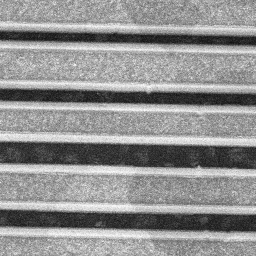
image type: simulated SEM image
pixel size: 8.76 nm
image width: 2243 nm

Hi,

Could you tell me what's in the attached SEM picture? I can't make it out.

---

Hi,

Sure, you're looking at one or a few lines or trenches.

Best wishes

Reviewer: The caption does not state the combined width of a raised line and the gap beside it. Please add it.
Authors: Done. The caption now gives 0.535 micrometres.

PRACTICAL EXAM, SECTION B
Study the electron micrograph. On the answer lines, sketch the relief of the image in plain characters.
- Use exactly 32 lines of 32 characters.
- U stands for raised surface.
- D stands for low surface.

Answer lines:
UUUUUUUUUUUUUUUUUUUUUUUUUUUUUUUU
UUUUUUUUUUUUUUUUUUUUUUUUUUUUUUUU
UUUUUUUUUUUUUUUUUUUUUUUUUUUUUUUU
DDDDDDDDDDUUUUUUUUUUUUUUUUUUUUUU
DDDDDDDDDDDDDDDDDDDDDDDDDDDDDDDD
DDDDDDDDDDDDDDDDDDDDDDDDDDDDDDDD
UUUUUUUUUUUUUUUUUUUUUUUUUUUUUUUU
UUUUUUUUUUUUUUUUUUUUUUUUUUUUUUUU
UUUUUUUUUUUUUUUUUUUUUUUUUUUUUUUU
UUUUUUUUUUUUUUUUUUUUUUUUUUUUUUUU
DUUUUUUUUUUUUUUUUUUUUUUUUUUUUUUU
DDDDDDDDDDDDDDDDDDDDDDDDDDDDDDDD
DDDDDDDDDDDDDDDDDDDDDDDDDDDDDDDD
UUUUUUUUUUUUUUUUDDUDDDDDDDDDDDDD
UUUUUUUUUUUUUUUUUUUUUUUUUUUUUUUU
UUUUUUUUUUUUUUUUUUUUUUUUUUUUUUUU
UUUUUUUUUUUUUUUUUUUUUUUUUUUUUUUU
DDDDDDDDDDDDDDDDDDDDDUUUUUUUUUUU
DDDDDDDDDDDDDDDDDDDDDDDDDDDDDDDD
DDDDDDDDDDDDDDDDDDDDDDDDDDDDDDDD
DDDDDDDDDDDDDDDDDDDDDDDDDDDDDDDD
UUUUUUUUUUUUUUUUUUUUUUUUUDDDDDDD
UUUUUUUUUUUUUUUUUUUUUUUUUUUUUUUU
UUUUUUUUUUUUUUUUUUUUUUUUUUUUUUUU
UUUUUUUUUUUUUUUUUUUUUUUUUUUUUUUU
UUUUUUUUUUUUUUUUUUUUUUUUUUUUUUUU
DDDDDDDDDDDDDDDDDDDDDDDDDDDDDDDD
DDDDDDDDDDDDDDDDDDDDDDDDDDDDDDDD
DDDDDDDDDDDDDDDDDDDDDDDDDDDDDDDD
UUUUUUUUUUUUUUUUUUUUUUUUUUUUDDDD
UUUUUUUUUUUUUUUUUUUUUUUUUUUUUUUU
UUUUUUUUUUUUUUUUUUUUUUUUUUUUUUUU